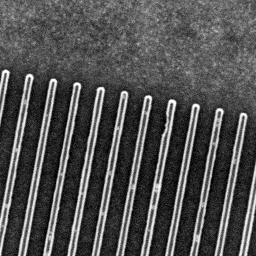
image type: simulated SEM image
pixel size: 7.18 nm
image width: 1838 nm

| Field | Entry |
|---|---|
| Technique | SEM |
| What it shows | parallel lines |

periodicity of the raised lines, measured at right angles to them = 173 nm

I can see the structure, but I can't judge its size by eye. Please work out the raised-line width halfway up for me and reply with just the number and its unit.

41.1 nm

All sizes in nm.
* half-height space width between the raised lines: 130